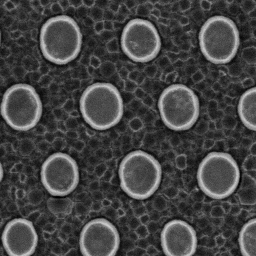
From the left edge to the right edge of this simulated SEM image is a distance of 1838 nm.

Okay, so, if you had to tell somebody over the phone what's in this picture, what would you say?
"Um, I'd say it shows a regular array of raised bodies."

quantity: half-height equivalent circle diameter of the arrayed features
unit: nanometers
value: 294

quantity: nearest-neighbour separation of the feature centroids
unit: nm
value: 553